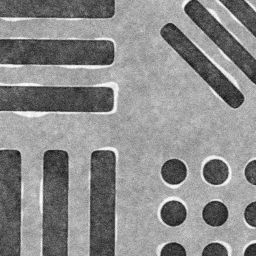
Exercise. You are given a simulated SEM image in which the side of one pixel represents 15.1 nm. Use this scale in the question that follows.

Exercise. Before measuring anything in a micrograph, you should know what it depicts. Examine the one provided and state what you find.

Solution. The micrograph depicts groups of lines, slits or small figures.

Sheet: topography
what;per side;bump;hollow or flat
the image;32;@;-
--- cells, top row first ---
--------------@@@@@@@@@--@@@---@
--------------@@@@@@@@@---@@@---
@@@@@@@@@@@@@@@@@@@@@@@@---@@@--
@@@@@@@@@@@@@@@@@@@@--@@@---@@@-
@@@@@@@@@@@@@@@@@@@@---@@@---@@@
--------------@@@@@@@---@@@---@@
--------------@@@@@@@@---@@@---@
--------------@@@@@@@@@---@@@---
@@@@@@@@@@@@@@@@@@@@@@@@---@@@--
@@@@@@@@@@@@@@@@@@@@@@@@@----@@-
@@@@@@@@@@@@@@@@@@@@@@@@@@---@@@
---------------@@@@@@@@@@@@---@@
--------------@@@@@@@@@@@@@@--@@
--------------@@@@@@@@@@@@@@@-@@
@@@@@@@@@@@@@@@@@@@@@@@@@@@@@@@@
@@@@@@@@@@@@@@@@@@@@@@@@@@@@@@@@
@@@@@@@@@@@@@@@@@@@@@@@@@@@@@@@@
@@@@@@@@@@@@@@@@@@@@@@@@@@@@@@@@
@@@@@@@@@@@@@@@@@@@@@@@@@@@@@@@@
---@@----@@----@@@@@@@@@@@@@@@@@
---@@----@@----@@@@@---@@---@@@-
---@@----@@----@@@@@---@@----@--
---@@----@@----@@@@@---@@@--@@@-
---@@----@@----@@@@@@@@@@@@@@@@@
---@@----@@----@@@@@@@@@@@@@@@@@
---@@----@@----@@@@@---@@@--@@@-
---@@----@@---@@@@@@---@@----@--
---@@----@@----@@@@@---@@---@@@-
---@@----@@----@@@@@@@@@@@@@@@@@
---@@----@@----@@@@@@@@@@@@@@@@@
---@@----@@---@@@@@@@-@@@@--@@@-
---@@----@@---@@@@@@---@@----@--